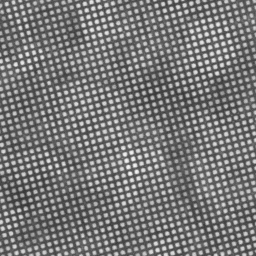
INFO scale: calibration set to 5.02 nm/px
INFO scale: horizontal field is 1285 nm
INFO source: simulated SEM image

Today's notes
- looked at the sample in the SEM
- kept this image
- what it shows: a regular array of raised bodies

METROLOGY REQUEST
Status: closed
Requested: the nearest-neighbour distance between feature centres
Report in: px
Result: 6.63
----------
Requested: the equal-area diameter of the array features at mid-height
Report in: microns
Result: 0.0196